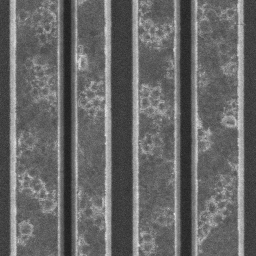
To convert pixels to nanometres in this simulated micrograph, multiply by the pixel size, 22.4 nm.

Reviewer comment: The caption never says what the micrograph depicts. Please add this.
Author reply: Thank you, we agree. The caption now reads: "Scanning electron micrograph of one or a few lines or trenches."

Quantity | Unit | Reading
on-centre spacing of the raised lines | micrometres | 1.35